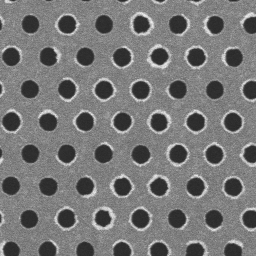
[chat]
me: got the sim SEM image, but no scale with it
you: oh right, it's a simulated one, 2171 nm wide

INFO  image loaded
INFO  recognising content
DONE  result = a regular array of holes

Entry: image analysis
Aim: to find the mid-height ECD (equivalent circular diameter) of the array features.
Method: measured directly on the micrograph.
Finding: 154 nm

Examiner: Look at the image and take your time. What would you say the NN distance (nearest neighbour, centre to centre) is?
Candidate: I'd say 0.312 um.